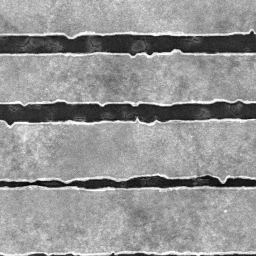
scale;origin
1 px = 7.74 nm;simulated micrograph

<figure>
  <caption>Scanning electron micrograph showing one or a few lines or trenches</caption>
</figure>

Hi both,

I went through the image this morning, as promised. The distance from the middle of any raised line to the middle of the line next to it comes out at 551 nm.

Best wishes